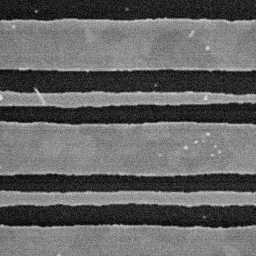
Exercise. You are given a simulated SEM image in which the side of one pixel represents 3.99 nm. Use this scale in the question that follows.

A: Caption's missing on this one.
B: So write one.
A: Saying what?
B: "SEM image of lines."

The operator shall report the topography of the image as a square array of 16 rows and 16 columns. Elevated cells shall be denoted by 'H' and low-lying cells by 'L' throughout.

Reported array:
LLLLLLLLLLLLLLLL
HHHHHHHHHHHHHHHH
HHHHHHHHHHHHHHHH
HHHHHHHHHHHHHHHH
LLLLLLLLLLLLLLLL
LLLLLLLLLLLLLLLL
LLLLLLLLLLLLLLLL
LLLLLLLLLLLLLLLL
HHHHHHHHHHHHHHHH
HHHHHHHHHHHHHHHH
HHHHHHHHHHHHHHHH
LLLLLLLLLLLLLLLL
LLLLLLLLLLLLLLLL
LLLLLLLLLLLLLLLL
HHHHHHHHHHHHHHHH
HHHHHHHHHHHHHHHH